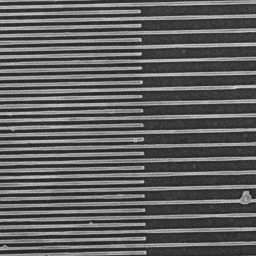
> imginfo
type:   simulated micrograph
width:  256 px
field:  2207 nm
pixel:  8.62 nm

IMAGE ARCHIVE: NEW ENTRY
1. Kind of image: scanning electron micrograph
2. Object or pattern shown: parallel lines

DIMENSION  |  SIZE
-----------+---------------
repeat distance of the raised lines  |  61.2 nm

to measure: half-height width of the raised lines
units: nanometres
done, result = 19.4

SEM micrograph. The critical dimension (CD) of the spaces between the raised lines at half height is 37.7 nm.